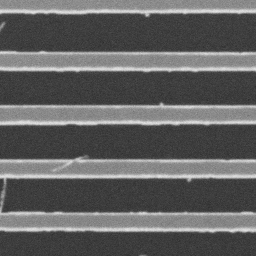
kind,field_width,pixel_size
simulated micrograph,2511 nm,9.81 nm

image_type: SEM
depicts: lines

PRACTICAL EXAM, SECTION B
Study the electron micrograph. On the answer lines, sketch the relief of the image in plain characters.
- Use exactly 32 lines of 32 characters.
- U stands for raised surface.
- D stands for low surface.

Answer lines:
UUUUUUUUUUUUUUUUUUUUUUUUUUUUUUUU
UDDUUUUUUUUUUDDUUUUUUUDUDDDDDUUD
DDDDDDDDDDDDDDDDDDDDDDDDDDDDDDDD
DDDDDDDDDDDDDDDDDDDDDDDDDDDDDDDD
DDDDDDDDDDDDDDDDDDDDDDDDDDDDDDDD
DDDDDDDDDDDDDDDDDDDDDDDDDDDDDDDD
UUDDDUDDDDDDDDDDDDDDDDDDDDDDDDDD
UUUUUUUUUUUUUUUUUUUUUUUUUUUUUUUU
UUUUUUUUUUUUUUUUUUUUUUUUUUUUUUUU
DDDDDDDDDDDDDDDDDDDDDDDDDDDDDDDD
DDDDDDDDDDDDDDDDDDDDDDDDDDDDDDDD
DDDDDDDDDDDDDDDDDDDDDDDDDDDDDDDD
DDDDDDDDDDDDDDDDDDDDDDDDDDDDDDDD
UUUUUUUUUUUUUUUUUUUUUUUUUUUUUUUU
UUUUUUUUUUUUUUUUUUUUUUUUUUUUUUUU
DDDDDDDDDDDDDDDDDDDDDDDDDDDDDDDD
DDDDDDDDDDDDDDDDDDDDDDDDDDDDDDDD
DDDDDDDDDDDDDDDDDDDDDDDDDDDDDDDD
DDDDDDDDDDDDDDDDDDDDDDDDDDDDDDDD
DDDDDDDDDDDDDDDDDDDDDDDDDDDDDDDD
UUUUUUUUUUUUUUUUUUUUUUUUUUUUUUUU
UUUUUUUUUUUUUUUUUUUUUUUUUUUUUUUU
DDDDDDDDDDDDDDDDDDDDDDDDDDDDDDDD
DDDDDDDDDDDDDDDDDDDDDDDDDDDDDDDD
DDDDDDDDDDDDDDDDDDDDDDDDDDDDDDDD
DDDDDDDDDDDDDDDDDDDDDDDDDDDDDDDD
DDDDDDDDDDDDDDDDDDDDDDDDDDDDDDDD
UUUUUUUUUUUUUUUUUUUUUUUUUUUUUUUU
UUUUUUUUUUUUUUUUUUUUUUUUUUUUUUUU
DDDDDDDDDDDDDDDDDDDDDDDDDDDDDDDD
DDDDDDDDDDDDDDDDDDDDDDDDDDDDDDDD
DDDDDDDDDDDDDDDDDDDDDDDDDDDDDDDD